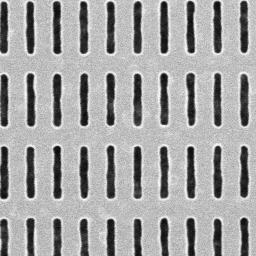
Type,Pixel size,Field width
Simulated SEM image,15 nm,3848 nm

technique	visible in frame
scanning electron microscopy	a regular array of holes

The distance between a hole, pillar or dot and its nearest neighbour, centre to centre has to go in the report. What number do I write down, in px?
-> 26.7